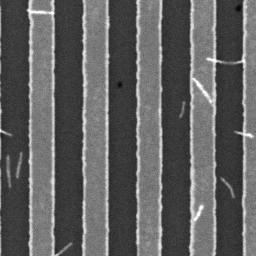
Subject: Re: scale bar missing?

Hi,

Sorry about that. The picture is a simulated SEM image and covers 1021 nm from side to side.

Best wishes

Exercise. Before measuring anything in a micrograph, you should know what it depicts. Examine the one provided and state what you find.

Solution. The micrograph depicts lines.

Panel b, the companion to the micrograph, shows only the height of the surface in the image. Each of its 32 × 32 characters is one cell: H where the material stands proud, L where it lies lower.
LLLLHHHLLLHHHLLLLHHHLLLLHHHLLLHH
LLLLHHHLLLLHHLLLLHHHLLLLHHHLLLHH
LLLLHHHLLLHHHHLLLHHHLLLLHHHLLLHH
LLLLHHHLLLHHHHLLLHHHLLLLHHHLLLHH
LLLLHHHLLLHHHLLLLHHHLLLLHHHLLLHH
LLLLHHHLLLHHHLLLLHHHLLLLHHHLLLHH
LLLLHHHLLLHHHHLLLHHHLLLLHHHLLLHH
LLLLHHHLLLHHHLLLLHHHLLLLHHHLLLHH
LLLLHHHLLLHHHLLLLHHHLLLLHHHLLLHH
LLLLHHHLLLHHHLLLLHHHLLLLHHHLLLHH
LLLLHHHLLLLHHLLLLHHHLLLLHHHLLLHH
LLLLHHHLLLLHHLLLLHHHLLLLHHHLLLHH
LLLLHHHLLLLHHLLLLHHHLLLLHHHLLLHH
LLLLHHHLLLHHHLLLLHHHLLLLHHHLLLHH
LLLLHHHLLLHHHLLLLHHHLLLLHHHLLLHH
LLLLHHHLLLHHHLLLLHHHLLLLHHHLLLHH
LLLLHHHLLLHHHLLLLHHHLLLLHHHLLLHH
LLLLHHHLLLLHHLLLLHHHLLLLHHHLLLHH
LLLLHHHLLLHHHLLLLHHHLLLLHHHLLLHH
LLLLHHHLLLHHHLLLLHHHLLLLHHHLLLHH
LLLLHHHLLLHHHLLLLHHHLLLLHHHLLLHH
LLLLHHHLLLHHHLLLLHHHLLLLHHHLLLHH
LLLLHHHLLLLHHLLLLHHHLLLLHHHLLLHH
LLLLHHHLLLLHHLLLLHHHLLLLHHHLLLHH
LLLLHHHLLLLHHLLLLHHHLLLLHHHLLLHH
LLLLHHHLLLHHHLLLLHHHLLLLHHHLLLHH
LLLLHHHLLLHHHLLLLHHHLLLLHHHLLLHH
LLLLHHHLLLHHHLLLLHHHLLLLHHHLLLHH
LLLLHHHLLLHHHLLLLHHHLLLLHHHLLLHH
LLLLHHHLLLHHHLLLLHHHLLLLHHHLLLHH
LLLLHHHLLLHHHLLLLHHHLLLLHHHLLLHH
LLLLHHHLLLHHHLLLLHHHLLLLHHHLLLHH